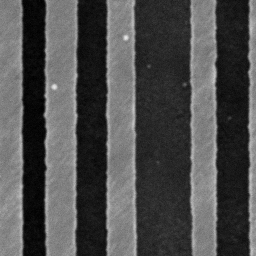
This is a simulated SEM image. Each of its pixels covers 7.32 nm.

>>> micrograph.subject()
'lines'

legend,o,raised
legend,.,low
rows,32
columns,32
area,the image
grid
ooo...oooo...oooo.......ooo....o
ooo...oooo...oooo.......ooo....o
ooo...oooo...oooo.......ooo....o
ooo...oooo...oooo.......ooo....o
ooo...oooo...oooo.......ooo....o
ooo...oooo...oooo.......ooo....o
ooo...oooo...oooo.......ooo....o
ooo...oooo...oooo.......ooo....o
ooo...oooo...oooo.......ooo....o
ooo...oooo...oooo.......ooo....o
ooo...oooo...oooo.......ooo....o
ooo...oooo...oooo.......ooo....o
ooo...oooo...oooo.......ooo....o
ooo...oooo...oooo.......ooo....o
ooo...oooo...oooo.......ooo....o
ooo...oooo...oooo.......ooo....o
ooo...ooo....oooo.......ooo....o
ooo...oooo...oooo.......ooo....o
ooo...oooo...oooo.......ooo....o
ooo...oooo...oooo.......ooo....o
ooo...oooo...oooo.......ooo....o
ooo...oooo...oooo.......ooo....o
ooo...oooo...oooo.......ooo....o
ooo...oooo...oooo.......ooo....o
ooo...oooo...oooo.......ooo....o
ooo...ooo....oooo.......ooo....o
ooo...oooo...oooo.......ooo....o
ooo...oooo...oooo.......ooo....o
ooo...oooo...oooo.......ooo....o
ooo...ooo....oooo.......ooo....o
ooo...ooo....oooo.......ooo....o
ooo...oooo...oooo.......ooo....o